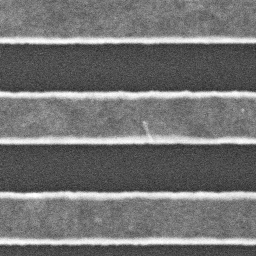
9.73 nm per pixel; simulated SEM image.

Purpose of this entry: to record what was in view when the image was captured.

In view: lines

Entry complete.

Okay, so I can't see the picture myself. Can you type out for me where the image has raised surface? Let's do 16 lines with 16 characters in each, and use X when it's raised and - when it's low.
XXXXXXXXXXXXXXXX
XXXXXXXXXXXXXXXX
XXXXXXXXXXXXXXXX
----------------
----------------
----------------
XXXXXXXXXXXXXXXX
XXXXXXXXXXXXXXXX
XXXXXXXXXXXXXXXX
----------------
----------------
----------------
XXXXXXXXXXXXXXXX
XXXXXXXXXXXXXXXX
XXXXXXXXXXXXXXXX
----------------